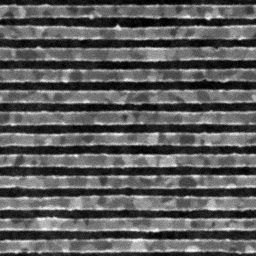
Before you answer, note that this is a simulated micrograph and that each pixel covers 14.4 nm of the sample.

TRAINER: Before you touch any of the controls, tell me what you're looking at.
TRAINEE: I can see parallel lines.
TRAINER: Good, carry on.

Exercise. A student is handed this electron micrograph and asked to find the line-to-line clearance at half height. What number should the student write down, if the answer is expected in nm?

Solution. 133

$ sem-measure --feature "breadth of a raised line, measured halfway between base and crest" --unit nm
175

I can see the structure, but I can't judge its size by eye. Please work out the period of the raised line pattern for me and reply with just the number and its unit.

0.307 µm